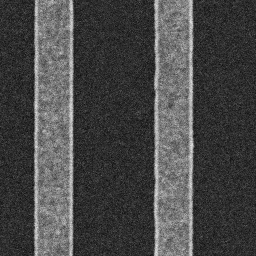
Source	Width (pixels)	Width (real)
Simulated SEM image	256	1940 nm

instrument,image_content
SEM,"one or a few lines or trenches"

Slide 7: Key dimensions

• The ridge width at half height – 268 nm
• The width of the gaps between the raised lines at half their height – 640 nm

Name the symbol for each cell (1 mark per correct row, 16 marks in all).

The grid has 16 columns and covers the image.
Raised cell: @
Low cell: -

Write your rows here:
--@@------@@----
--@@------@@----
--@@------@@----
--@@------@@----
--@@------@@----
--@@------@@----
--@@------@@----
--@@------@@----
--@@------@@----
--@@------@@----
--@@------@@----
--@@------@@----
--@@------@@----
--@@------@@----
--@@------@@----
--@@------@@----